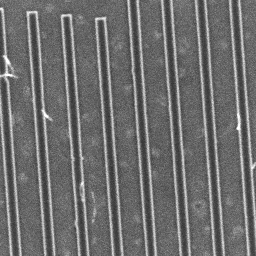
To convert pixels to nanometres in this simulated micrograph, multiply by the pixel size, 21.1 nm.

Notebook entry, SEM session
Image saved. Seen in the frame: parallel lines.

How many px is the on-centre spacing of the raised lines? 33.8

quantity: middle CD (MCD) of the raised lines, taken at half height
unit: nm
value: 215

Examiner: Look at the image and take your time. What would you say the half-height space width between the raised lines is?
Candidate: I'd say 512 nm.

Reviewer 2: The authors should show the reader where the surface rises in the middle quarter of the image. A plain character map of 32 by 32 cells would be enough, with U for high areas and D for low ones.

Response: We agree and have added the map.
UUUDDDDDDUUDDDDDDUUDDDDDDDUUDDDD
DUUDDDDDDUUDDDDDDUUUDDDDDDUUDDDD
DUUDDDDDDUUDDDDDDUUUDDDDDDUUDDDD
DUUDDDDDDUUDDDDDDDUUDDDDDDUUDDDD
DUUDDDDDDUUUDDDDDDUUDDDDDDUUDDDD
DUUDDDDDDUUDDDDDDDUUDDDDDDUUDDDD
DUUDDDDDDUUDDDDDDDUUDDDDDDUUUDDD
DUUDDDDDDUUUDDDDDDUUDDDDDDUUUDDD
DUUDDDDDDUUUDDDDDDUUDDDDDDUUUDDD
DUUDDDDDDDUUDDDDDDUUDDDDDDUUUDDD
DUUDDDDDDDUUDDDDDDUUDDDDDDUUUDDD
DUUDDDDDDDUUDDDDDDUUDDDDDDDUUDDD
DUUDDDDDDDUUDDDDDDUUDDDDDDDUUDDD
DUUUDDDDDDUUDDDDDDUUDDDDDDDUUDDD
DUUUDDDDDDUUDDDDDDUUDDDDDDDUUDDD
DDUUDDDDDDUUDDDDDDUUUDDDDDDUUDDD
DDUUDDDDDDUUDDDDDDUUUDDDDDDUUDDD
DDUUDDDDDDUUDDDDDDDUUDDDDDDUUDDD
DDUUDDDDDDUUDDDDDDDUUDDDDDDUUDDD
DDUUDDDDDDUUDDDDDDDUUDDDDDDUUDDD
DDUUDDDDDDUUDDDDDDDUUDDDDDDUUUDD
DDUUDDDDDDUUUDDDDDDUUDDDDDDUUUDD
DDUUDDDDDDUUUDDDDDDUUDDDDDDUUUDD
DDUUDDDDDDDUUDDDDDDUUDDDDDDUUUDD
DDUUDDDDDDDUUDDDDDDUUDDDDDDUUUDD
DDUUDDDDDDDUUDDDDDDUUDDDDDDDUUDD
DDUUDDDDDDDUUDDDDDDUUDDDDDDDUUDD
DDUUUDDDDDDUUDDDDDDUUDDDDDDDUUDD
DDUUUDDDDDDUUDDDDDDUUDDDDDDDUUDD
DDDUUDDDDDDUUDDDDDDUUUDDDDDDUUDD
DDDUUDDDDDDUUDDDDDDUUUDDDDDDUUDD
DDDUUDDDDDDUUDDDDDDDUUDDDDDDUUDD